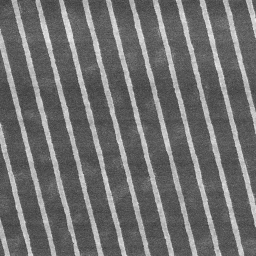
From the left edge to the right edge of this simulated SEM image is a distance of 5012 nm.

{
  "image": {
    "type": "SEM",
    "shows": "parallel lines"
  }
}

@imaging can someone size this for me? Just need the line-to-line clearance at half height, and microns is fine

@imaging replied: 0.356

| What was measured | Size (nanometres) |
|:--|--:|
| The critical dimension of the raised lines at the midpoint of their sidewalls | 83.1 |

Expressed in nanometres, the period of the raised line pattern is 446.